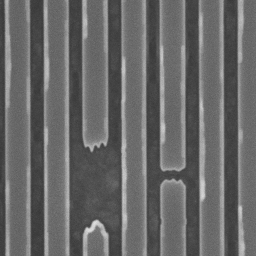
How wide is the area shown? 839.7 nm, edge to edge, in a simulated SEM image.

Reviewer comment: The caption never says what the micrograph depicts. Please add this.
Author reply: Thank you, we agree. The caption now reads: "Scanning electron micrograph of parallel lines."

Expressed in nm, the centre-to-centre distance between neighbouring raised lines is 127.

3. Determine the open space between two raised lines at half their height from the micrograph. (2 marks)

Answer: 46.7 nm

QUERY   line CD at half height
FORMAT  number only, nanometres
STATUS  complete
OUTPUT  81.5